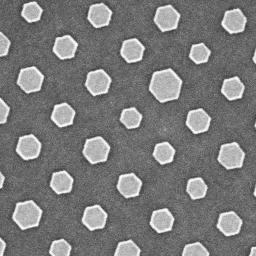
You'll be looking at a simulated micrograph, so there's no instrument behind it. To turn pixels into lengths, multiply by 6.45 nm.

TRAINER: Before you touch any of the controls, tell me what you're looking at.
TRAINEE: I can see a regular array of raised bodies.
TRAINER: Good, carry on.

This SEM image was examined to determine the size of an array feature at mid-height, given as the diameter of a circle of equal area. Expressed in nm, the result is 148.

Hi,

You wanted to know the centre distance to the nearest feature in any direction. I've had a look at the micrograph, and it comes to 304 nm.